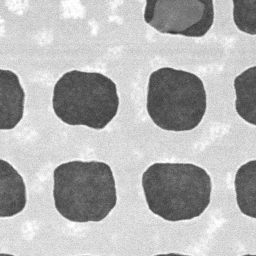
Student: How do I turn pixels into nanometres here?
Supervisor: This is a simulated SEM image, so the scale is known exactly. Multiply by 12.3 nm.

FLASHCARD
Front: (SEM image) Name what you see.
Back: holes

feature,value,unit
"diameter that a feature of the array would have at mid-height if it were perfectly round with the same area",794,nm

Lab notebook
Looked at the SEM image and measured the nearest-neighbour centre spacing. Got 1.11 micrometres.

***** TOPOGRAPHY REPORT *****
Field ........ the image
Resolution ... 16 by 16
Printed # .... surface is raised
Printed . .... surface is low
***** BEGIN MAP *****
#########....##.
#########....##.
################
################
.###.#####..###.
.##....##....##.
..#....##....##.
.###...###...##.
################
################
.###...##....##.
..#....##....##.
..#....##....##.
.###...###..####
################
################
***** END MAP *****